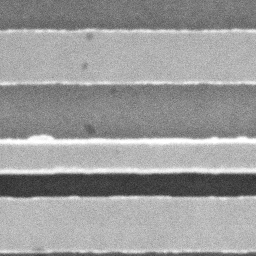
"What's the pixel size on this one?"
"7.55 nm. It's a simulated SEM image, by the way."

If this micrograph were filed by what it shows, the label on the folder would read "lines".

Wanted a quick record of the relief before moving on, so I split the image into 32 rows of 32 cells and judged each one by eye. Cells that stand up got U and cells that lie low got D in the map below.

DDDDDDDDDDDDDDDDDDDDDDDDDDDDDDDD
DDDDDDDDDDDDDDDDDDDDDDDDDDDDDDDD
DDDDDDDDDDDDDDDDDDDDDDDDDDDDDDDD
DDDDDDDDDDDDDDDDDDDDDDDDDDDDDDDD
UUUUUUUUUUUUUUUUUUUUUUUUUUUUUUUU
UUUUUUUUUUUUUUUUUUUUUUUUUUUUUUUU
UUUUUUUUUUUUUUUUUUUUUUUUUUUUUUUU
UUUUUUUUUUUUUUUUUUUUUUUUUUUUUUUU
UUUUUUUUUUUUUUUUUUUUUUUUUUUUUUUU
UUUUUUUUUUUUUUUUUUUUUUUUUUUUUUUU
DDDDDDDDDDDDDDDDDDDDDDDDDDDDDDDD
DDDDDDDDDDDDDDDDDDDDDDDDDDDDDDDD
DDDDDDDDDDDDDDDDDDDDDDDDDDDDDDDD
DDDDDDDDDDDDDDDDDDDDDDDDDDDDDDDD
DDDDDDDDDDDDDDDDDDDDDDDDDDDDDDDD
DDDDDDDDDDDDDDDDDDDDDDDDDDDDDDDD
DDDDDDDDDDDDDDDDDDDDDDDDDDDDDDDD
DDDDDDDDDDDUUDDDDDDDDUUUDDUUUUUU
UUUUUUUUUUUUUUUUUUUUUUUUUUUUUUUU
UUUUUUUUUUUUUUUUUUUUUUUUUUUUUUUU
UUUUUUUUUUUUUUUUUUUUUUUUUUUUUUUU
UUUUUUUUUUUUUUUUUUUUUUDDUUUUUUUU
DDDDDDDDDDDDDDDDDDDDDDDDDDDDDDDD
DDDDDDDDDDDDDDDDDDDDDDDDDDDDDDDD
DDDDDDDDDDDDDDDDDDDDDDDDDDDDDDDD
UUUUUUUUUUUUUUUUUUUUUUUUUUUUUUUU
UUUUUUUUUUUUUUUUUUUUUUUUUUUUUUUU
UUUUUUUUUUUUUUUUUUUUUUUUUUUUUUUU
UUUUUUUUUUUUUUUUUUUUUUUUUUUUUUUU
UUUUUUUUUUUUUUUUUUUUUUUUUUUUUUUU
UUUUUUUUUUUUUUUUUUUUUUUUUUUUUUUU
UUUUUUUDDDUUUUDUUUDUUUUDDDDUUUUD